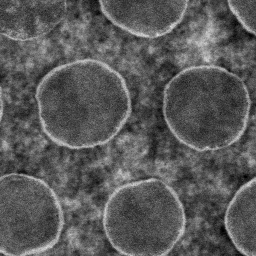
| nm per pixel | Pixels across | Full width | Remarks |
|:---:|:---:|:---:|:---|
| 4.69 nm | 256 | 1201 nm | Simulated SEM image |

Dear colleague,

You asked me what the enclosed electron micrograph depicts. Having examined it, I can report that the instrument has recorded raised bodies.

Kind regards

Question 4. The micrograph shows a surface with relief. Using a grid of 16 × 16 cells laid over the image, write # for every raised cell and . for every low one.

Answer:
......######..##
.......####....#
................
................
...####....###..
..######..#####.
..######..######
...#####..#####.
...####....####.
................
................
###.....##......
####...####....#
####...####...##
####...####...##
###....####....#